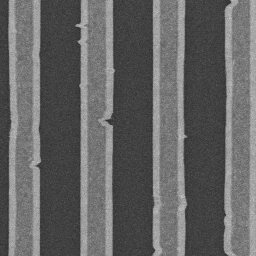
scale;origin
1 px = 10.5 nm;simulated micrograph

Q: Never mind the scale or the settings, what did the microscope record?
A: one or a few lines or trenches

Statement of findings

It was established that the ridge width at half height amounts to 0.251 microns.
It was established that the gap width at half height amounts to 504 nanometres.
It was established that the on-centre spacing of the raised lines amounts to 755 nanometres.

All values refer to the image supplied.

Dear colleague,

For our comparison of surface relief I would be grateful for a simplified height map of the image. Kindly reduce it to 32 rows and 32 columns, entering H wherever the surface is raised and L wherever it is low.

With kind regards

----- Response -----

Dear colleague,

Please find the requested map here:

LLHHHLLLLLLHHHLLLLLLHHHLLLLLLHHH
LLHHHLLLLLLHHHLLLLLLHHHLLLLLLHHH
LLHHHLLLLLLHHHLLLLLLHHHLLLLLLHHH
LLHHHLLLLLHHHHLLLLLLHHHLLLLLLHHH
LLHHHLLLLLLHHHLLLLLLHHHLLLLLLHHH
LLHHHLLLLLHHHHLLLLLLHHHLLLLLLHHH
LLHHLLLLLLLHHHLLLLLLHHHLLLLLLHHH
LLHHLLLLLLLHHHLLLLLLHHHLLLLLLHHH
LLHHLLLLLLLHHHLLLLLLHHLLLLLLLHHH
LLHHLLLLLLLHHHLLLLLLHHLLLLLLLHHH
LLHHLLLLLLLHHHLLLLLLHHLLLLLLLHHH
LLHHLLLLLLLHHHLLLLLLHHLLLLLLLHHH
LLHHLLLLLLLHHHLLLLLLHHLLLLLLLHHH
LLHHHLLLLLLHHHLLLLLLHHLLLLLLLHHH
LLHHLLLLLLLHHLLLLLLLHHLLLLLLLHHH
LLHHLLLLLLLHHLLLLLLLHHLLLLLLLHHH
LLHHLLLLLLLHHHLLLLLLHHHLLLLLLHHH
LLHHHLLLLLLHHHLLLLLLHHHLLLLLLHHH
LLHHHLLLLLLHHHLLLLLLHHHLLLLLLHHH
LLHHHLLLLLLHHHLLLLLLHHHLLLLLLHHH
LLHHLLLLLLLHHHLLLLLLHHLLLLLLLHHH
LLHHLLLLLLLHHHLLLLLLHHHLLLLLLHHH
LLHHHLLLLLLHHHLLLLLLHHHLLLLLLHHH
LLHHHLLLLLLHHHLLLLLLHHHLLLLLLHHH
LLHHLLLLLLLHHHLLLLLLHHHLLLLLLHHH
LLHHHLLLLLLHHHLLLLLLHHHLLLLLLHHH
LLHHLLLLLLLHHHLLLLLLHHHLLLLLLHHH
LLHHLLLLLLLHHHLLLLLLHHHLLLLLLHHH
LLHHLLLLLLLHHHLLLLLLHHHLLLLLLHHH
LLHHLLLLLLLHHHLLLLLLHHHLLLLLLHHH
LHHHLLLLLLLHHHLLLLLLHHHLLLLLLHHH
LHHHLLLLLLLHHHLLLLLLHHHLLLLLLHHH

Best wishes